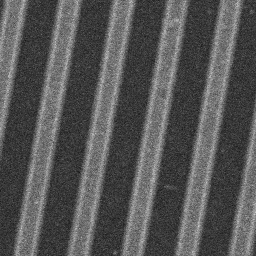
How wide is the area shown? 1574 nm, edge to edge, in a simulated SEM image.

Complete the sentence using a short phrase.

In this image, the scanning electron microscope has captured parallel lines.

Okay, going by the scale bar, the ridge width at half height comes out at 120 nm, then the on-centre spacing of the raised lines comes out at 326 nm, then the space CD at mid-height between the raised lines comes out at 0.206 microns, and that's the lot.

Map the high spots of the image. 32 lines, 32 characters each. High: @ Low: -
-@@----@@@----@@@----@@-----@@--
-@@----@@@----@@-----@@----@@@--
@@@----@@@----@@-----@@----@@@--
@@@----@@-----@@----@@@----@@@--
@@-----@@----@@@----@@@----@@---
@@-----@@----@@@----@@-----@@---
@@----@@@----@@@----@@-----@@---
@@----@@@----@@-----@@----@@@---
@@----@@-----@@----@@@----@@@---
@@----@@-----@@----@@@----@@----
@-----@@----@@@----@@@----@@----
@----@@@----@@@----@@-----@@----
@----@@@----@@-----@@----@@@----
@----@@@----@@-----@@----@@@----
@----@@-----@@----@@@----@@@----
@----@@-----@@----@@@----@@-----
-----@@----@@@----@@@----@@-----
----@@@----@@@----@@-----@@----@
----@@@----@@-----@@----@@@----@
----@@@----@@-----@@----@@@----@
----@@-----@@----@@@----@@@----@
----@@----@@@----@@@----@@-----@
----@@----@@@----@@-----@@----@@
---@@@----@@@----@@-----@@----@@
---@@@----@@-----@@----@@@----@@
---@@-----@@----@@@----@@@----@@
---@@-----@@----@@@----@@-----@@
---@@----@@@----@@@----@@-----@@
--@@@----@@@----@@-----@@----@@@
--@@@----@@-----@@----@@@----@@@
--@@@----@@-----@@----@@@----@@-
--@@-----@@----@@@----@@@----@@-